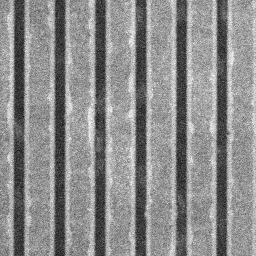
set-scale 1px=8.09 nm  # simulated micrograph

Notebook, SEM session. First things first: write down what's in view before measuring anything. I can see parallel lines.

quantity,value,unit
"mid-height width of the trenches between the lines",119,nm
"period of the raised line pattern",328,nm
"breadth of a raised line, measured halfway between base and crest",212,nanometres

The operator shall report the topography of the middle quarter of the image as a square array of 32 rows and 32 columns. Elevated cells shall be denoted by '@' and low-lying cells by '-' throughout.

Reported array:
-@@@@@@----@@@@@@----@@@@@@----@
-@@@@@@----@@@@@@----@@@@@@----@
-@@@@@@----@@@@@@----@@@@@@----@
-@@@@@@----@@@@@@----@@@@@@----@
-@@@@@@----@@@@@@----@@@@@@----@
-@@@@@@----@@@@@@----@@@@@@----@
-@@@@@@----@@@@@@----@@@@@@----@
-@@@@@@----@@@@@@----@@@@@@----@
-@@@@@@----@@@@@@----@@@@@@----@
-@@@@@@----@@@@@@----@@@@@@----@
-@@@@@@----@@@@@@----@@@@@@----@
-@@@@@@----@@@@@@----@@@@@@----@
-@@@@@@----@@@@@@----@@@@@@----@
-@@@@@@----@@@@@@----@@@@@@----@
-@@@@@@----@@@@@@----@@@@@@----@
-@@@@@@----@@@@@@----@@@@@@----@
-@@@@@@----@@@@@@----@@@@@@----@
-@@@@@@----@@@@@@----@@@@@@----@
-@@@@@@----@@@@@@----@@@@@@----@
-@@@@@@----@@@@@@----@@@@@@----@
-@@@@@@----@@@@@@----@@@@@@----@
-@@@@@@----@@@@@@----@@@@@@----@
-@@@@@@----@@@@@@----@@@@@@----@
-@@@@@@----@@@@@@----@@@@@@----@
-@@@@@@----@@@@@@----@@@@@@----@
-@@@@@@----@@@@@@----@@@@@@----@
-@@@@@@----@@@@@@----@@@@@@----@
-@@@@@@----@@@@@@----@@@@@@----@
-@@@@@@----@@@@@@----@@@@@@----@
-@@@@@@----@@@@@@----@@@@@@----@
-@@@@@@----@@@@@@----@@@@@@----@
-@@@@@@----@@@@@@----@@@@@@----@